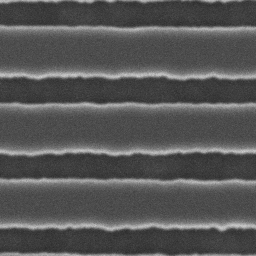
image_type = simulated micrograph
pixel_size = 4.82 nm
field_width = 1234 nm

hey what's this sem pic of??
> lines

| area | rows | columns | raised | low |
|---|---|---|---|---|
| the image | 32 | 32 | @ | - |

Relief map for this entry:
--------------------------------
--------------------------------
--------------------------------
@@@@@@@@@@@@@@---@@@@@@--@-@--@@
@@@@@@@@@@@@@@@@@@@@@@@@@@@@@@@@
@@@@@@@@@@@@@@@@@@@@@@@@@@@@@@@@
@@@@@@@@@@@@@@@@@@@@@@@@@@@@@@@@
@@@@@@@@@@@@@@@@@@@@@@@@@@@@@@@@
@@@@@@@@@@@@@@@@@@@@@@@@@@@@@@@@
@@-@@@-@@@@@@@@@@@-@-@@@@@@@@@@@
--------------------------------
--------------------------------
--------------------------------
@@@@@@@@@@@@@@@@@@@@@@@@@@@@@@@@
@@@@@@@@@@@@@@@@@@@@@@@@@@@@@@@@
@@@@@@@@@@@@@@@@@@@@@@@@@@@@@@@@
@@@@@@@@@@@@@@@@@@@@@@@@@@@@@@@@
@@@@@@@@@@@@@@@@@@@@@@@@@@@@@@@@
@@@@@@@@@@@@@@@@@@@@@@@@@@@@@@@@
--------------------------------
--------------------------------
--------------------------------
@-@@@@-@@@@@--@@@-----@---------
@@@@@@@@@@@@@@@@@@@@@@@@@@@@@@@@
@@@@@@@@@@@@@@@@@@@@@@@@@@@@@@@@
@@@@@@@@@@@@@@@@@@@@@@@@@@@@@@@@
@@@@@@@@@@@@@@@@@@@@@@@@@@@@@@@@
@@@@@@@@@@@@@@@@@@@@@@@@@@@@@@@@
-------------@@------------@----
--------------------------------
--------------------------------
--------------------------------